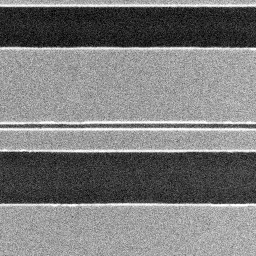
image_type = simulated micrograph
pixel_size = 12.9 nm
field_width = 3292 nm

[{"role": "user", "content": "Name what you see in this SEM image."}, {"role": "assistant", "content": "lines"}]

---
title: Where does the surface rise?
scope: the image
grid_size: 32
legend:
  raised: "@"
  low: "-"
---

@@@@@@@@@@@@@@@@@@@@@@@@@@@@@@@@
--------------------------------
--------------------------------
--------------------------------
--------------------------------
--------------------------------
@@@@@@@@@@@@@@@@@@@@@@@@@@@@@@@@
@@@@@@@@@@@@@@@@@@@@@@@@@@@@@@@@
@@@@@@@@@@@@@@@@@@@@@@@@@@@@@@@@
@@@@@@@@@@@@@@@@@@@@@@@@@@@@@@@@
@@@@@@@@@@@@@@@@@@@@@@@@@@@@@@@@
@@@@@@@@@@@@@@@@@@@@@@@@@@@@@@@@
@@@@@@@@@@@@@@@@@@@@@@@@@@@@@@@@
@@@@@@@@@@@@@@@@@@@@@@@@@@@@@@@@
@@@@@@@@@@@@@@@@@@@@@@@@@@@@@@@@
@@@@@@@@@@@@@@@@@@@@@@@@@@@@@@@@
@@@@@@@@@@@@@@@@@@@@@@@@@@@@@@@@
@@@@@@@@@@@@@@@@@@@@@@@@@@@@@@@@
@@@@@@@@@@@@@@@@@@@@@@@@@@@@@@@@
--------------------------------
--------------------------------
--------------------------------
--------------------------------
--------------------------------
--------------------------------
--------------------------------
@@@@@@@@@@@@@@@@@@@@@@@@@@@@@@@@
@@@@@@@@@@@@@@@@@@@@@@@@@@@@@@@@
@@@@@@@@@@@@@@@@@@@@@@@@@@@@@@@@
@@@@@@@@@@@@@@@@@@@@@@@@@@@@@@@@
@@@@@@@@@@@@@@@@@@@@@@@@@@@@@@@@
@@@@@@@@@@@@@@@@@@@@@@@@@@@@@@@@